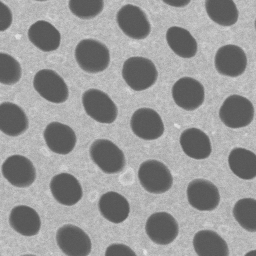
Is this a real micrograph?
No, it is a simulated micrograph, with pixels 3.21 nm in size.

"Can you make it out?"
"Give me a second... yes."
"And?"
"a regular array of holes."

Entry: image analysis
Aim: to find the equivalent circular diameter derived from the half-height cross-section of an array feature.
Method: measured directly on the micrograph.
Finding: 99.8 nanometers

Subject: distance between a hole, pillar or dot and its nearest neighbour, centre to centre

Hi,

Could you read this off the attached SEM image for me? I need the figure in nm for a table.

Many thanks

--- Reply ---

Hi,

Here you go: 163